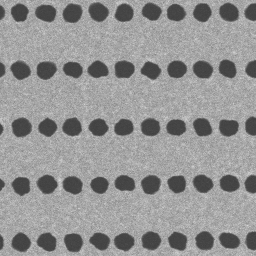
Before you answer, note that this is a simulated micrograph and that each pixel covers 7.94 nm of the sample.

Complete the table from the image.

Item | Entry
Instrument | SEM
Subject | a regular array of holes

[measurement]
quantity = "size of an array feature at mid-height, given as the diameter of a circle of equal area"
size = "144 nm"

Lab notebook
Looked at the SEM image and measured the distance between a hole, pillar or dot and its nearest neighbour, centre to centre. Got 203 nanometres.